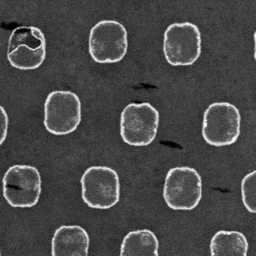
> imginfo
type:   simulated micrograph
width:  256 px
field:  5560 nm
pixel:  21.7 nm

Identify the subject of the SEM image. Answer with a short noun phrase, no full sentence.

a regular array of raised bodies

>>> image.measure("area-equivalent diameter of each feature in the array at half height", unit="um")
0.88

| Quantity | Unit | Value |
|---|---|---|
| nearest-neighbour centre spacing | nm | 1610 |